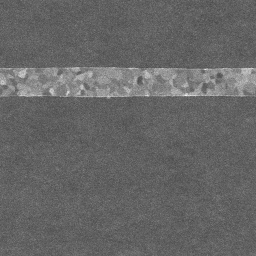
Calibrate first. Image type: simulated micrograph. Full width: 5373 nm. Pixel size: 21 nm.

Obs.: one or a few lines or trenches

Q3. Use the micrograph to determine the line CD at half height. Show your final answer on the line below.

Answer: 577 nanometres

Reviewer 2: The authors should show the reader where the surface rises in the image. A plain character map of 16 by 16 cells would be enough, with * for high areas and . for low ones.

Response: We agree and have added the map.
................
................
................
................
****************
****************
................
................
................
................
................
................
................
................
................
................